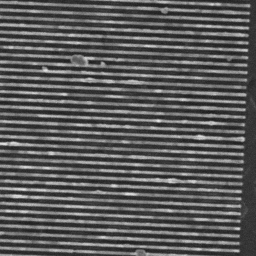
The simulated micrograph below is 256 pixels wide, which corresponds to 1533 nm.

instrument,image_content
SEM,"parallel lines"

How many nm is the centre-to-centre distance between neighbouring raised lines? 44.6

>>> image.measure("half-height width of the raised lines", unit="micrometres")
0.0142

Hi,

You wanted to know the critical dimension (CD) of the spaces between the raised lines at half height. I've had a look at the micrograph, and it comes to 0.0314 micrometres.